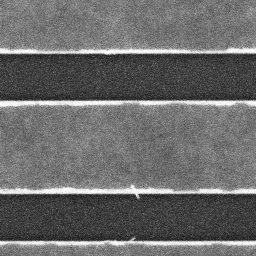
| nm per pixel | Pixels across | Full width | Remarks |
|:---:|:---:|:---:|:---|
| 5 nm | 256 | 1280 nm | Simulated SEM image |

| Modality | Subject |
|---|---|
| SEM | one or a few lines or trenches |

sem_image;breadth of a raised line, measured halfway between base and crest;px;91.1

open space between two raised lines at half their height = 246 nanometers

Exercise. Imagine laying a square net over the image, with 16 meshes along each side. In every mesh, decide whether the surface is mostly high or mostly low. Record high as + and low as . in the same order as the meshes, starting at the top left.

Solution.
++++++++++++++++
++++++++++++++++
++++++++++++++++
................
................
................
++++++++++++++++
++++++++++++++++
++++++++++++++++
++++++++++++++++
++++++++++++++++
++++++++++++++++
................
................
................
++++++++++++++++